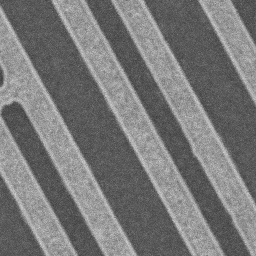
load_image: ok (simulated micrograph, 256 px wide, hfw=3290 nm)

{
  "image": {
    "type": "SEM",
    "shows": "one or a few lines or trenches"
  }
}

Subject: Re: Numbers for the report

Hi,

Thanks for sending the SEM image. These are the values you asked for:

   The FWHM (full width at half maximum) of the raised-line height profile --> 330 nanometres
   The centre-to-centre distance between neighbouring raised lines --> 800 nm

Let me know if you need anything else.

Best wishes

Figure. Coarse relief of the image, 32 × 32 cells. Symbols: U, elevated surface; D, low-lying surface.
DDDDDDDUUUUDDDUUUUDDDDDDDUUUUDDD
DDDDDDDUUUUDDDDUUUUDDDDDDDUUUDDD
UDDDDDDDUUUUDDDUUUUDDDDDDDUUUUDD
UDDDDDDDDUUUDDDDUUUUDDDDDDDUUUDD
UUDDDDDDDUUUUDDDDUUUDDDDDDDDUUUD
UUDDDDDDDDUUUDDDDUUUUDDDDDDDUUUU
UUUDDDDDDDUUUUDDDDUUUDDDDDDDDUUU
UUUDDDDDDDDUUUDDDDUUUUDDDDDDDUUU
UUUUDDDDDDDUUUUDDDDUUUDDDDDDDDUU
DUUUUDDDDDDDUUUUDDDUUUUDDDDDDDUU
DUUUUDDDDDDDUUUUDDDDUUUDDDDDDDDU
UUUUUUDDDDDDDUUUUDDDUUUUDDDDDDDU
UUUUUUDDDDDDDDUUUDDDDUUUUDDDDDDD
DDDUUUUDDDDDDDUUUUDDDUUUUDDDDDDD
DDDDUUUDDDDDDDDUUUDDDDUUUUDDDDDD
DDDDUUUUDDDDDDDUUUUDDDDUUUDDDDDD
UDDDDUUUDDDDDDDDUUUDDDDUUUUDDDDD
UUDDDUUUUDDDDDDDUUUUDDDDUUUDDDDD
UUDDDDUUUUDDDDDDDUUUUDDDUUUUDDDD
UUUDDDUUUUDDDDDDDUUUUDDDDUUUDDDD
UUUDDDDUUUUDDDDDDDUUUUDDDUUUUDDD
UUUUDDDDUUUDDDDDDDDUUUDDDDUUUDDD
DUUUDDDDUUUUDDDDDDDUUUUDDDUUUUDD
DUUUUDDDDUUUDDDDDDDDUUUDDDDUUUUD
DDUUUDDDDUUUUDDDDDDDUUUUDDDDUUUD
DDUUUUDDDDUUUDDDDDDDDUUUDDDDUUUU
DDDUUUDDDDUUUUDDDDDDDUUUUDDDDUUU
DDDDUUUDDDDUUUDDDDDDDDUUUDDDDUUU
DDDDUUUUDDDUUUUDDDDDDDUUUUDDDDUU
DDDDDUUUDDDDUUUUDDDDDDDUUUUDDDUU
DDDDDUUUUDDDUUUUDDDDDDDUUUUDDDDU
DDDDDDUUUDDDDUUUUDDDDDDDUUUUDDDU